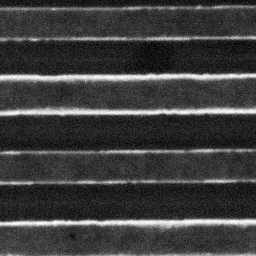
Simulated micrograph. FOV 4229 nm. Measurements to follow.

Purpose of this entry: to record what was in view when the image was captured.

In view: lines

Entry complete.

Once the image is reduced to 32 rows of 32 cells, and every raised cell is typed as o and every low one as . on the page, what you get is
................................
oooooooooooooooooooooooooooooooo
oooooooooooooooooooooooooooooooo
oooooooooooooooooooooooooooooooo
oooooooooooooooooooooooooooooooo
................................
................................
................................
................................
..................oooooooooooooo
oooooooooooooooooooooooooooooooo
oooooooooooooooooooooooooooooooo
oooooooooooooooooooooooooooooooo
oooooooooooooooooooooooooooooooo
................................
................................
................................
................................
................................
oooooooooooooooooooooooooooooooo
oooooooooooooooooooooooooooooooo
oooooooooooooooooooooooooooooooo
oooooooooooooooooooooooooooooooo
................................
................................
................................
................................
................................
oooooooooooooooooooooooooooooooo
oooooooooooooooooooooooooooooooo
oooooooooooooooooooooooooooooooo
oooooooooooooooooooooooooooooooo